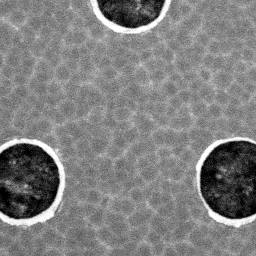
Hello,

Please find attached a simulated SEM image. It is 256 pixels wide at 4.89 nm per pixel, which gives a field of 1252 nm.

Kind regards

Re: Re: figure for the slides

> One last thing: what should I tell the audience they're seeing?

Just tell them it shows holes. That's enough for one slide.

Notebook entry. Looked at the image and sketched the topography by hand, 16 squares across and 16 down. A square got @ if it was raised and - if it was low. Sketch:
@@@@@@----@@@@@@
@@@@@@@--@@@@@@@
@@@@@@@@@@@@@@@@
@@@@@@@@@@@@@@@@
@@@@@@@@@@@@@@@@
@@@@@@@@@@@@@@@@
@@@@@@@@@@@@@@@@
@@@@@@@@@@@@@@@@
@@@@@@@@@@@@@@@@
---@@@@@@@@@@---
----@@@@@@@@@---
----@@@@@@@@----
---@@@@@@@@@@---
--@@@@@@@@@@@@--
@@@@@@@@@@@@@@@@
@@@@@@@@@@@@@@@@